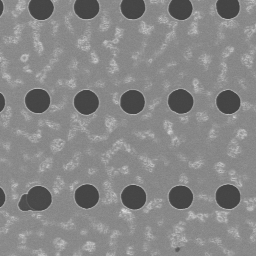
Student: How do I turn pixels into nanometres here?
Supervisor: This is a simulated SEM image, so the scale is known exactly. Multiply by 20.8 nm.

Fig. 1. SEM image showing a regular array of holes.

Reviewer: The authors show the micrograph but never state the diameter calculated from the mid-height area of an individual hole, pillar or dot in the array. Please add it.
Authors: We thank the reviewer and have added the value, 515 nanometers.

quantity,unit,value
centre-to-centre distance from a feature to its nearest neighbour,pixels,47.1